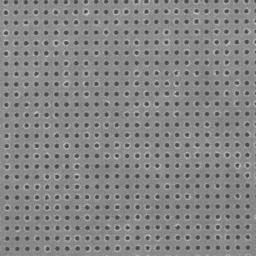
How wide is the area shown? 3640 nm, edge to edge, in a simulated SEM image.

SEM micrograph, a regular array of holes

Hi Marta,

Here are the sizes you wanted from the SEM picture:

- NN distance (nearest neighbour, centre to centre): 9.89 pixels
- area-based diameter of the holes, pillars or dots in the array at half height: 60 nm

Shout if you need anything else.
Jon